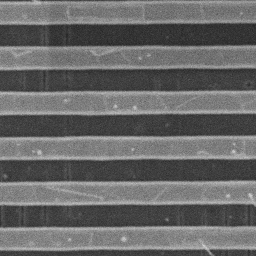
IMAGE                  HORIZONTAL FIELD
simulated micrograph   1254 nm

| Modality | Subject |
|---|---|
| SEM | wiring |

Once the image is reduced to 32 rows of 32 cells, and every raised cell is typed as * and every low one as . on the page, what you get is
********************************
********************************
********************************
................................
................................
................................
********************************
********************************
****............................
................................
................................
................................
********************************
********************************
................................
................................
................................
********************************
********************************
********************************
................................
................................
................................
********************************
********************************
................................
................................
................................
....................********...*
********************************
********************************
................................